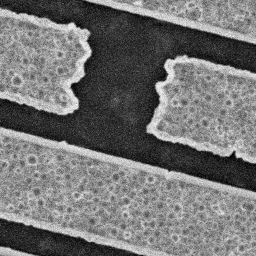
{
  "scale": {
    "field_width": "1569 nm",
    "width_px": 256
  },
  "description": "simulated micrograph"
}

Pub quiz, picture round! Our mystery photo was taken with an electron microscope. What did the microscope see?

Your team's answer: one or a few lines or trenches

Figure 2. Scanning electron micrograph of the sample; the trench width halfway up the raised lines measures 216 nm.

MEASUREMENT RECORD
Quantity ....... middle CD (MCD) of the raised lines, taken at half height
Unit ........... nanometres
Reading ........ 496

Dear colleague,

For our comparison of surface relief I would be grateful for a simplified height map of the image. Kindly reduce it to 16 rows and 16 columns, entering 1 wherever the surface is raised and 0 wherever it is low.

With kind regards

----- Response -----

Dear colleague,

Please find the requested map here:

0000000011111111
1110000000001111
1111100000000000
1111100000000000
1111100000011110
1111000000111111
0011100000111111
0000000000111111
1000000000111111
1111100000000011
1111111110000000
1111111111111000
1111111111111111
1111111111111111
0000111111111111
0000000011111111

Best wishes